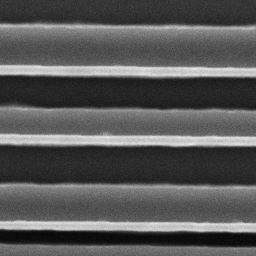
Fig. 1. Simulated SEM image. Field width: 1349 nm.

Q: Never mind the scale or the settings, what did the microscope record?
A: lines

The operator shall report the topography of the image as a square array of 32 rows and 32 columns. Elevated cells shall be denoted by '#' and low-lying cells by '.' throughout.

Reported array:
................................
................................
................................
###################.###.........
################################
################################
################################
################################
################################
...................##.........##
................................
................................
................................
................................
################################
################################
################################
################################
................................
................................
................................
................................
................................
##########################...##.
################################
################################
################################
################################
################################
................................
................................
################################